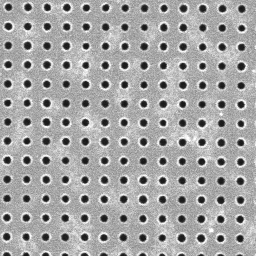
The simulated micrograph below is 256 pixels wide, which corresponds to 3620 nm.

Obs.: a regular array of holes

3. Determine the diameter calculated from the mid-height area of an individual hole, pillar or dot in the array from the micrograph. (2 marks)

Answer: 108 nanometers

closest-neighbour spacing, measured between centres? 268 nm